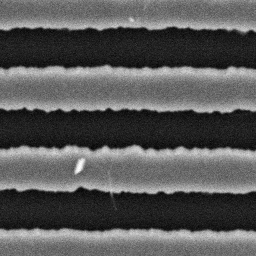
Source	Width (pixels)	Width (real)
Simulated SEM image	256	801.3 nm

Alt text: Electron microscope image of lines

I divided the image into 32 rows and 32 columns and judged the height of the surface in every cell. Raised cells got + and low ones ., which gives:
++++++++++++++++++++++++++++++++
++++++++++++++++++++++++++++++++
++++++++++++++++++++++++++++++++
++..+++++++.++....+++.++++++++++
................................
................................
................................
................................
.............+..................
++++++++++++++++++++++++++++++++
++++++++++++++++++++++++++++++++
++++++++++++++++++++++++++++++++
++++++++++++++++++++++++++++++++
++++++++++++++++++++++++++++++++
................................
................................
................................
................................
........++......+...............
++++++++++++++++++++++++++++++++
++++++++++++++++++++++++++++++++
++++++++++++++++++++++++++++++++
++++++++++++++++++++++++++++++++
++++++++++.+++++++++++++++++++++
................................
................................
................................
................................
................................
++++++++++++++++++++++++++++++++
++++++++++++++++++++++++++++++++
++++++++++++++++++++++++++++++++